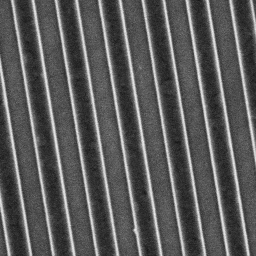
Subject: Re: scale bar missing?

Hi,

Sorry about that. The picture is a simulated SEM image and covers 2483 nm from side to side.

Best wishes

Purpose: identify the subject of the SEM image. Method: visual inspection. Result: parallel lines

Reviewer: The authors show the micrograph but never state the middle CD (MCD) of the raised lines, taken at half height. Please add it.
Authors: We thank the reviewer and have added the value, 205 nanometers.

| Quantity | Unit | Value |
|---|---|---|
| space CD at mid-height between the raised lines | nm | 213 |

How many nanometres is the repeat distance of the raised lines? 418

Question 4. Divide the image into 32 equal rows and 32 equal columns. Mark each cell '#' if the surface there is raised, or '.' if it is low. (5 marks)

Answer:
..##...###..###...###..###...###
..##...###...##...###...##...###
..###..###...##...###...##...###
..###..###...###..###...###..###
..###...##...###...##...###...##
..###...##...###...##...###...##
...##...###..###...###..###...##
...##...###...##...###..###...##
...###..###...##...###...##...##
...###..###...###..###...##...##
#..###...##...###...##...###...#
#..###...##...###...##...###...#
#...##...###..###...###..###...#
#...##...###...##...###...##...#
#...##...###...##...###...##...#
#...###..###...###..###...##...#
#...###...##...###..###...###..#
##..###...##...###...##...###...
##..###...###..###...###..###...
##...##...###...##...###..###...
##...##...###...##...###...##...
##...###..###...##...###...##...
##...###...##...###..###...###..
##...###...##...###...##...###..
###..###...###..###...##...###..
###...##...###..###...###..###..
###...##...###...##...###...##..
###...###..###...##...###...##..
.##...###...##...###..###...##..
.##...###...##...###...##...###.
.###..###...##...###...##...###.
.###...##...###..###...###..###.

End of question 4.